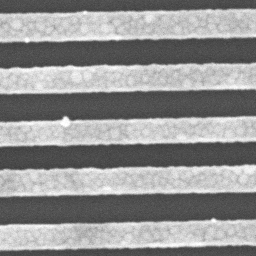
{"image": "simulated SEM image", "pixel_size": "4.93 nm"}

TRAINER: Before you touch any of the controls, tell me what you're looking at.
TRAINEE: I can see lines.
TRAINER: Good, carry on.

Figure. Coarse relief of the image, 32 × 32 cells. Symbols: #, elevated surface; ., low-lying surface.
................................
..........#....##.##############
################################
################################
################################
................................
................................
................................
....############################
################################
################################
#########.......................
................................
................................
................................
################################
################################
################################
................................
................................
................................
################################
################################
################################
##..............................
................................
................................
..........................#.....
################################
################################
################################
................................